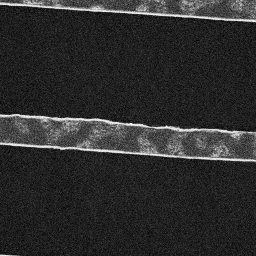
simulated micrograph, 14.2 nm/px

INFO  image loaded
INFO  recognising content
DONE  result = one or a few lines or trenches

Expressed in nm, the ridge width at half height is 408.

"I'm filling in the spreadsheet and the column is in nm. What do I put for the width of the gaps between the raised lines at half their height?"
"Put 1570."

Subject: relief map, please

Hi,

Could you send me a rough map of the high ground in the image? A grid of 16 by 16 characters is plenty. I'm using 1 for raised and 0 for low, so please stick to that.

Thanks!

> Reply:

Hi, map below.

0000111111111111
0000000000000000
0000000000000000
0000000000000000
0000000000000000
0000000000000000
0000000000000000
1111110000000000
1111111111111111
0000000111111111
0000000000000000
0000000000000000
0000000000000000
0000000000000000
0000000000000000
0000000000000000